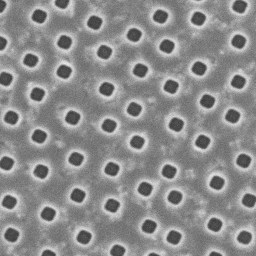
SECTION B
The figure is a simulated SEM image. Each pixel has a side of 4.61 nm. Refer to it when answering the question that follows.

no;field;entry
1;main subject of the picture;a regular array of holes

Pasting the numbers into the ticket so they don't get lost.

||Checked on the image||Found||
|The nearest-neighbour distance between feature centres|32.9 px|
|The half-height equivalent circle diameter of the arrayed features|69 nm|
